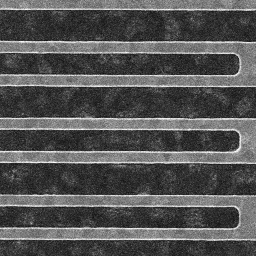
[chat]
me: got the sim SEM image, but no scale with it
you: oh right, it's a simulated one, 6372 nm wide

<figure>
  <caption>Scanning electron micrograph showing parallel lines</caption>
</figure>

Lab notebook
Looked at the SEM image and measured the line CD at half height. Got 0.258 um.